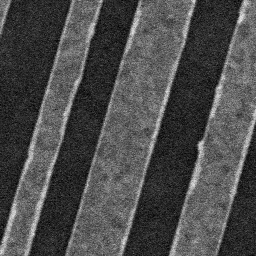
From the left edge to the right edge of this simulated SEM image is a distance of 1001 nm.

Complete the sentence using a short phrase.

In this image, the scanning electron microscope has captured one or a few lines or trenches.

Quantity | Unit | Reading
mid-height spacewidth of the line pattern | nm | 174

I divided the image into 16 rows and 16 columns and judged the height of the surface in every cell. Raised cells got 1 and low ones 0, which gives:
0000110001110001
0000110011110001
0000110011110001
0000100011100011
0001100111100011
0001100111100011
0001000111000111
0011000111000111
0011001111000111
0011001110001110
0010001110001110
0110011110001110
0110011110001110
0100011100011100
1100011100011100
1100111100011100